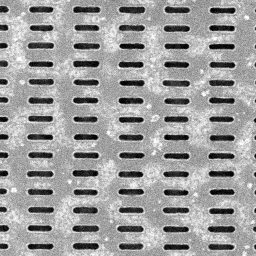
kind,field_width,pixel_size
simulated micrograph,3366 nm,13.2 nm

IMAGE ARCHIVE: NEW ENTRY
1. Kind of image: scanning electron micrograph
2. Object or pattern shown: a regular array of holes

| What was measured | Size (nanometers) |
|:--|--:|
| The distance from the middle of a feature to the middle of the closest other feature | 234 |